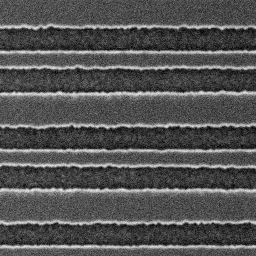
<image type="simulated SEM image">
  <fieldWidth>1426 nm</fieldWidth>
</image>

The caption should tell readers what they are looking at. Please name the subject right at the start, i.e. lines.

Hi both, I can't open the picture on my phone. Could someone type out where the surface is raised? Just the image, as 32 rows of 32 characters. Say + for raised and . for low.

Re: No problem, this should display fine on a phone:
++++++++++++++++++++++++++++++++
++++++++++++++++++++++++++++++++
++++++++++++++++++++++++++++++++
....+......................+....
................................
................................
++++++++++++++++++++++++++++++++
++++++++++++++++++++++++++++++++
.+++..+++.++++.+++++++.++.++++++
................................
................................
................................
++++++++++++++++++++++++++++++++
++++++++++++++++++++++++++++++++
++++++++++++++++++++++++++++++++
++++++++++++++++++++++++++++++++
................................
................................
................................
++++++++++++++++++++++++++++++++
++++++++++++++++++++++++++++++++
................................
................................
................................
++++++++++++++++++++++++++++++++
++++++++++++++++++++++++++++++++
++++++++++++++++++++++++++++++++
++++++++++++++++++++++++++++++++
................................
................................
................................
++++++++++++++++++++++++++++++++